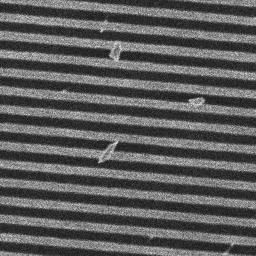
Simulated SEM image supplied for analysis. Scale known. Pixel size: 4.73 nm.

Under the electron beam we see parallel lines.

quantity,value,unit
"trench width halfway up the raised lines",43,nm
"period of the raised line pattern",0.0865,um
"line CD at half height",46.5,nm